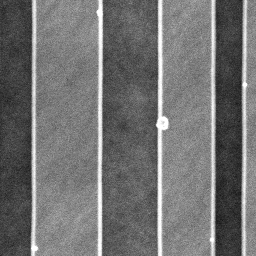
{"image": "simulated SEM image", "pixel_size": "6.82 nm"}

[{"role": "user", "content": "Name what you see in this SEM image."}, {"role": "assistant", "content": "groups of lines, slits or small figures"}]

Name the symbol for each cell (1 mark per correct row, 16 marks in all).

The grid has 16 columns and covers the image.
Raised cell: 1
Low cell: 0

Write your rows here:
0011110000111001
0011110000111001
0011110000111001
0011110000111001
0011110000111001
0011110000111001
0011110000111001
0011110000111001
0011110000111001
0011110000111001
0011110000111001
0011110000111001
0011110000111001
0011110000111001
0011110000111001
0011110000111001